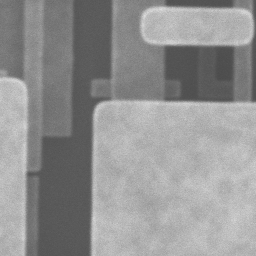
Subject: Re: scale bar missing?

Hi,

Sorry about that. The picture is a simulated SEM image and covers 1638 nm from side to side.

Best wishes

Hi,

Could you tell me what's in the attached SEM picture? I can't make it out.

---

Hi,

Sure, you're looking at wiring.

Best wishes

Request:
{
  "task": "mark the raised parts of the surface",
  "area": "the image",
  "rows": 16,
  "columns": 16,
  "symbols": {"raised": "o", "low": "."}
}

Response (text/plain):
..........ooo...
.........ooooooo
.........ooooooo
................
................
oo..............
oo....oooooooooo
oo....oooooooooo
oo....oooooooooo
oo....oooooooooo
oo....oooooooooo
oo....oooooooooo
oo....oooooooooo
oo....oooooooooo
oo....oooooooooo
oo....oooooooooo